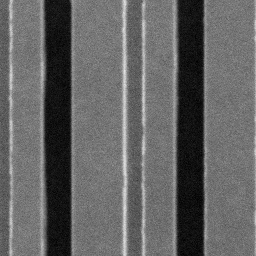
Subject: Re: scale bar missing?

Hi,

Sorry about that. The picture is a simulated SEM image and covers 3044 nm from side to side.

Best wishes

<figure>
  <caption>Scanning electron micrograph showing lines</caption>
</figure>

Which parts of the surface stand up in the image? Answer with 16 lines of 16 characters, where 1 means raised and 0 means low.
1110011111100111
1110011111100111
1110011111100111
1110011111100111
1110011111100111
1110011111100111
1110011111100111
1110011111100111
1110011111100111
1110011111100111
1110011111100111
1110011111100111
1110011111100111
1110011111100111
1110011111100111
1110011111100111